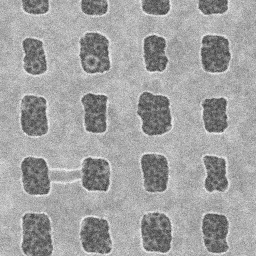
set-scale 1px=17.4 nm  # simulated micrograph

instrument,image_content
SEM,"a regular array of holes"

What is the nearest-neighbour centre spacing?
1040 nm